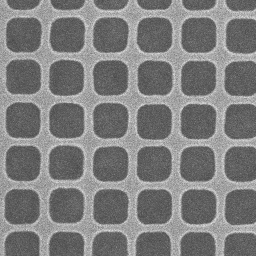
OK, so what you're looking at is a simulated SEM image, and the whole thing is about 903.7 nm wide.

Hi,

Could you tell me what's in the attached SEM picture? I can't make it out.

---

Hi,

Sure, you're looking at a regular array of holes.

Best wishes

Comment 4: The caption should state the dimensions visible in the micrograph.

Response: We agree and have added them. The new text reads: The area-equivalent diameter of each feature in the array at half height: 136 nm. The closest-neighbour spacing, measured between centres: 150 nm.